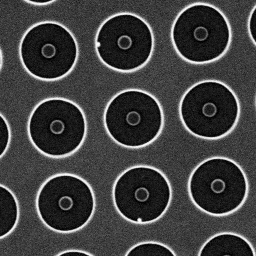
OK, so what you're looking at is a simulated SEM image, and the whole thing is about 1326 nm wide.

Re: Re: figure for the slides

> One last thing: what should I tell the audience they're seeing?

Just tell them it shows an array of small figures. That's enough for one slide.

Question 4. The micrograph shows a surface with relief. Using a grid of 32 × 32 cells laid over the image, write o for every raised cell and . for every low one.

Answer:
oooooooooooooooooooooooooooooooo
ooooooooooooooooooooooo....ooooo
oooooooooooooo....oooo......ooo.
oooo....ooooo......ooo.......oo.
ooo......ooo.......ooo..oo...oo.
ooo......ooo...o...ooo.......ooo
ooo..oo...oo.......ooo......oooo
ooo......oooo.....ooooo....ooooo
ooo......ooooo...ooooooooooooooo
oooo....oooooooooooooooooooooooo
ooooooooooooooooooooooooo...oooo
oooooooooooooooo..oooooo.....ooo
oooooo..oooooo.....oooo.......oo
ooooo.....ooo.......ooo..oo...oo
oooo......ooo...o...ooo.......oo
.ooo..oo...oo...o...ooo......ooo
.ooo...o...ooo......oooo....oooo
.ooo......oooo.....ooooooooooooo
.oooo.....oooooooooooooooooooooo
oooooooooooooooooooooooooooooooo
ooooooooooooooooooooooooo....ooo
oooooooooooooooo....oooo......oo
oooooo....ooooo......ooo.......o
.oooo......ooo.......ooo...o...o
..ooo.......oo...o...ooo.......o
..ooo..oo...ooo......oooo.....oo
..ooo......oooo.....oooooo...ooo
..ooo......ooooo...ooooooooooooo
..ooooo...oooooooooooooooooooooo
ooooooooooooooooooooooooooo...oo
oooooooooooooooooo..oooooo.....o
oooooooo..oooooo.....oooo.......